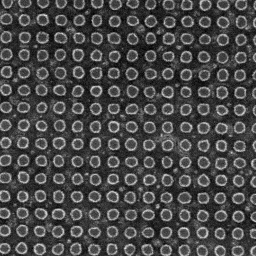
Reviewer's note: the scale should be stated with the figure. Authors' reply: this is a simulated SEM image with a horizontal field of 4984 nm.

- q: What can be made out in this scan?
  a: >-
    a regular array of raised bodies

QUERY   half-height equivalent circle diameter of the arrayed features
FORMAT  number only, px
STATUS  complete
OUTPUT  10.9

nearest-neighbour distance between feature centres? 336 nm